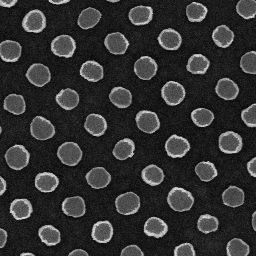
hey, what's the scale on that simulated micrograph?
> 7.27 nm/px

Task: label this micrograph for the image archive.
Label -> a regular array of raised bodies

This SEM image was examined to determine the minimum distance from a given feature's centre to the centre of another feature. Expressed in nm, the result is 271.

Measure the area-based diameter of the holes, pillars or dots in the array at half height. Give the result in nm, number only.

158